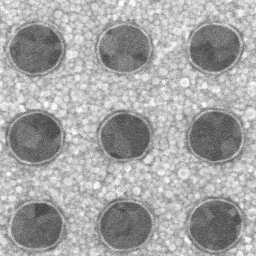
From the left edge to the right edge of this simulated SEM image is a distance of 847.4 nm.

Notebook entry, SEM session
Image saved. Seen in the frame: a regular array of raised bodies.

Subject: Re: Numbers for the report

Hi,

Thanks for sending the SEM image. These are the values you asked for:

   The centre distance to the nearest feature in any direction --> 88.6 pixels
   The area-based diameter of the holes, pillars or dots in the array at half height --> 0.173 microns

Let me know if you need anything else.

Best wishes